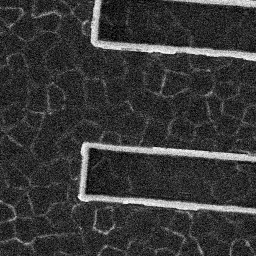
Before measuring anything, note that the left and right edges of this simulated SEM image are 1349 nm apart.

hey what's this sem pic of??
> one or a few lines or trenches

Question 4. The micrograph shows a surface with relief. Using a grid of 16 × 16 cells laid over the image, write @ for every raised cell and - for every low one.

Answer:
@@@@@@----------
@@@@@@----------
@@@@@@----------
@@@@@@@@@@@@@@@@
@@@@@@@@@@@@@@@@
@@@@@@@@@@@@@@@@
@@@@@@@@@@@@@@@@
@@@@@@@@@@@@@@@@
@@@@@@@@@@@@@@@@
@@@@@-----@@@@@@
@@@@@-----------
@@@@@-----------
@@@@@@@@@-------
@@@@@@@@@@@@@@@@
@@@@@@@@@@@@@@@@
@@@@@@@@@@@@@@@@